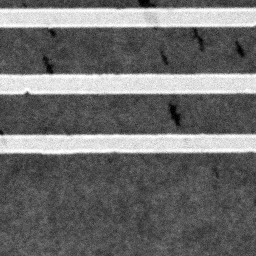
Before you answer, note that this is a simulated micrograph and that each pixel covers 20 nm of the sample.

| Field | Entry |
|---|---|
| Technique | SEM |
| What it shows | one or a few lines or trenches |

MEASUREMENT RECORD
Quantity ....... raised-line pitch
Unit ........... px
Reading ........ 62.8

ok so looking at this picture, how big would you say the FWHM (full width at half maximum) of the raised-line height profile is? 292 nanometres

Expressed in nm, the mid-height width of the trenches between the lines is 973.